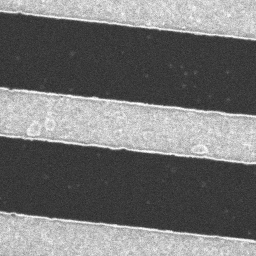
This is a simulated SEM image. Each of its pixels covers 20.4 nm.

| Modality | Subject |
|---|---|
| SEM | one or a few lines or trenches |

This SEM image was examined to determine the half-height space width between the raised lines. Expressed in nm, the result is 944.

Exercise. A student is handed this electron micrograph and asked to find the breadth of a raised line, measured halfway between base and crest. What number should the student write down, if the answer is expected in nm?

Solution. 1580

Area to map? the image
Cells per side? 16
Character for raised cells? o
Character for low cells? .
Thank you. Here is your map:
................
ooooooo.........
oooooooooooooooo
oooooooooooooooo
oooooooooooooooo
oooooooooooooooo
.........ooooooo
................
................
oooooooooo......
oooooooooooooooo
oooooooooooooooo
oooooooooooooooo
.ooooooooooooooo
..........oooooo
................